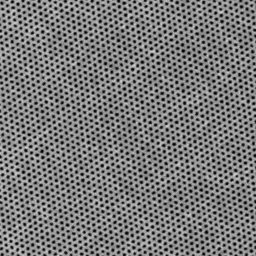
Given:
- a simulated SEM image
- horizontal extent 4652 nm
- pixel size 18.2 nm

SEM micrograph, a regular array of holes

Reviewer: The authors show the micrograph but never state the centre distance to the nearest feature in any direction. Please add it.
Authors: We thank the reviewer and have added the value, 106 nm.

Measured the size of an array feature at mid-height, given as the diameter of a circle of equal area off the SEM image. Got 71 nm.